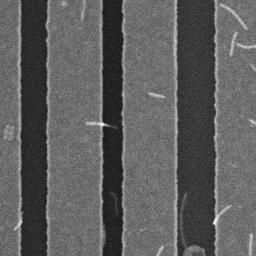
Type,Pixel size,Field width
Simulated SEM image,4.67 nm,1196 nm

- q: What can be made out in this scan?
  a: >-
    lines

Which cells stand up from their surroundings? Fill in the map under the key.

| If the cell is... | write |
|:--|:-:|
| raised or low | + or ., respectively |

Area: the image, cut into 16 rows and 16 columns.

+..+++..+++..+++
+..+++..+++..+++
+..+++..+++..+++
+..+++..+++..+++
+..+++..+++..+++
+..+++..+++..+++
+..+++..+++..+++
+..+++..+++..+++
+..+++..+++..+++
+..+++..+++..+++
+..+++..+++..+++
+..+++..+++..+++
+..+++..+++..+++
+..+++..+++..+++
+..+++..+++..+++
+..+++..+++..+++